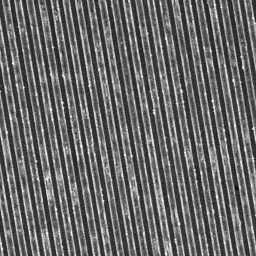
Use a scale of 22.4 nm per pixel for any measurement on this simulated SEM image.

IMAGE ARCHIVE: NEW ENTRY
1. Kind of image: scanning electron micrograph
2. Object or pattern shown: parallel lines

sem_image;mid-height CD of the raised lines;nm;152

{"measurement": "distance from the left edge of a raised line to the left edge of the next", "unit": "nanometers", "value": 267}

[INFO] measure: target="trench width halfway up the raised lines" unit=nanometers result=127